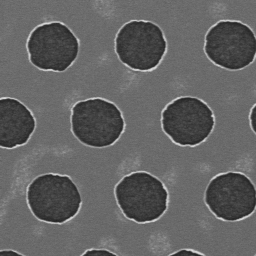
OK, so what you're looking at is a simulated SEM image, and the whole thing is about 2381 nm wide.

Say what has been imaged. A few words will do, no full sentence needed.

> holes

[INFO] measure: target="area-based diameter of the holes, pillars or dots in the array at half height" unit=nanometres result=460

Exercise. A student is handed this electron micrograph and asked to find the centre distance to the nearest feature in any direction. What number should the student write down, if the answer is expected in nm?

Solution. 811